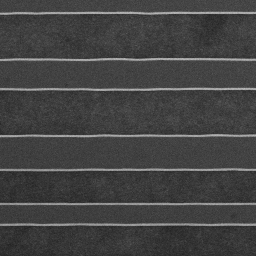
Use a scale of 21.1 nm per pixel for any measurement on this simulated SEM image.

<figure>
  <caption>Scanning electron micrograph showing groups of lines, slits or small figures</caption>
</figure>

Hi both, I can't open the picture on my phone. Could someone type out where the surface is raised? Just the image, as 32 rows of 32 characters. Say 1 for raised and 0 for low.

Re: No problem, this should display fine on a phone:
11111111111111111111111111111111
11111111111111111111111111111111
00000000000000000000000000000000
00000000000000000000000000000000
00000000000000000000000000000000
00000000000000000000000000000000
00000000000000000000000000000000
11111111110111111111111111111111
11111111111111111111111111111111
11111111111111111111111111111111
11111111111111111111111111111111
00000000000000000000000000000000
00000000000000000000000000000000
00000000000000000000000000000000
00000000000000000000000000000000
00000000000000000000000000000000
00000000000000000000000000000000
11111111111111111111111111111111
11111111111111111111111111111111
11111111111111111111111111111111
11111111111111111111111111111111
00000000000000000000000000000000
00000000000000000000000000000000
00000000000000000000000000000000
00000000000000000000000000000000
00000000000000000000000000000000
11111111111111111111111111111111
11111111111111111111111111111111
00000000000000000000000000000000
00000000000000000000000000000000
00000000000000000000000000000000
00000000000000000000000000000000